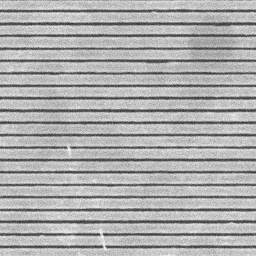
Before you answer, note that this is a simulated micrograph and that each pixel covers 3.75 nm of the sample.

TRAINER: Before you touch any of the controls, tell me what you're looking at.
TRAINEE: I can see parallel lines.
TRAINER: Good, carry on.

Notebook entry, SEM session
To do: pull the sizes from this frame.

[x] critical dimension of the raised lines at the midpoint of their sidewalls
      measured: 34.7 nanometres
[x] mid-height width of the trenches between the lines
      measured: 11.7 nm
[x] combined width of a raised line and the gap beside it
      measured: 46.6 nanometres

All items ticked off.